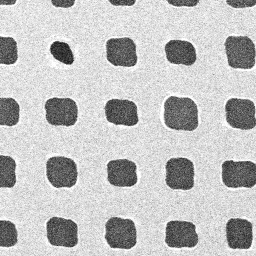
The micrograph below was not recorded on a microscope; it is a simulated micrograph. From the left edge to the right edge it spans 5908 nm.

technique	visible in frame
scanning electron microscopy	a regular array of holes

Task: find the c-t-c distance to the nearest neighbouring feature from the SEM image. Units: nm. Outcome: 1360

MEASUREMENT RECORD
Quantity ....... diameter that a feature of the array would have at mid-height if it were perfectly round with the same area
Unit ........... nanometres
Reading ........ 760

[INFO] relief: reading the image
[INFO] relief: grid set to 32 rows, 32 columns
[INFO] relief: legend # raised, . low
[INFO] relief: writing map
..#####..#####...####....###....
################################
################################
################################
#############################..#
..####..#####....####...####....
..####...####....####....###....
..#####..####....####...####....
#############################..#
################################
################################
################################
..####...#####..#####...#####..#
..####....###....###.....###....
...###....###....###.....###....
..####...#####...####....###....
################################
################################
################################
.###############################
..####....###....####...####....
..####....###....####...####....
..####....####...####...####....
.######..############...#####.##
################################
################################
################################
.#####...#####...############..#
..####....###....####...####....
..####....###....####....###....
..####....####...####....###...#
################################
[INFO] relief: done